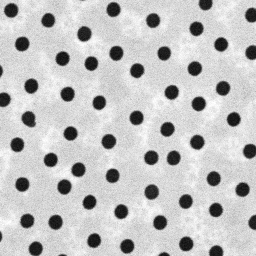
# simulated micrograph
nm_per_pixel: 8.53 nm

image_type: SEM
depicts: a regular array of holes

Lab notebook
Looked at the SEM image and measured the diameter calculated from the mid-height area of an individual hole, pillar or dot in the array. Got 126 nanometres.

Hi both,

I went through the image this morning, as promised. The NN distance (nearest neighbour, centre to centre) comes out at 264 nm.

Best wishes